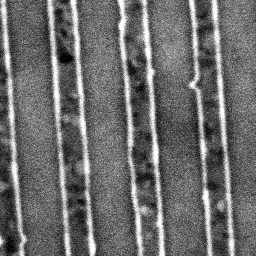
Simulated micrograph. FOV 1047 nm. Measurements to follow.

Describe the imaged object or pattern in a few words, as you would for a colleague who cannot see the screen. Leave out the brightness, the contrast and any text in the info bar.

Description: one or a few lines or trenches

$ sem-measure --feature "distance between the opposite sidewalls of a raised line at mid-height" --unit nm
102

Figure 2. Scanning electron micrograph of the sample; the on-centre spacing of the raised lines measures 288 nm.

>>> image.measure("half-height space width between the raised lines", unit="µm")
0.186